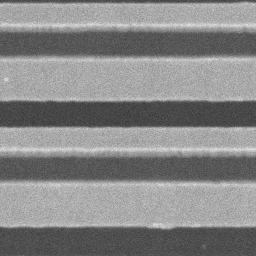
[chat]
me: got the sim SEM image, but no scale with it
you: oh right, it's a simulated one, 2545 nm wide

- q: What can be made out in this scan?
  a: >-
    lines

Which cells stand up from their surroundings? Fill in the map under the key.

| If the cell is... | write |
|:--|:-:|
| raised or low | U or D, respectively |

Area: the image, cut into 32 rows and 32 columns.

UUUUUUUUUUUUUUUUUUUUUUUUUUUUUUUU
UUUUUUUUUUUUUUUUUUUUUUUUUUUUUUUU
UUUUUUUUUUUUUUUUUUUUUUUUUUUUUUUU
DDDDDDDDDDDDDDDDDDDDDDDDDDDDDDDD
DDDDDDDDDDDDDDDDDDDDDDDDDDDDDDDD
DDDDDDDDDDDDDDDDDDDDDDDDDDDDDDDD
DDDDDDDDDDDDDDDDDDDDDDDDDDDDDDDD
UDUUUUUUUUUUUDUUUUUUUUUUUUUUUUUU
UUUUUUUUUUUUUUUUUUUUUUUUUUUUUUUU
UUUUUUUUUUUUUUUUUUUUUUUUUUUUUUUU
UUUUUUUUUUUUUUUUUUUUUUUUUUUUUUUU
UUUUUUUUUUUUUUUUUUUUUUUUUUUUUUUU
UUDUUUUUUUUUUUUUUUUUUUUUUDUUUUUD
DDDDDDDDDDDDDDDDDDDDDDDDDDDDDDDD
DDDDDDDDDDDDDDDDDDDDDDDDDDDDDDDD
DDDDDDDDDDDDDDDDDDDDDDDDDDDDDDDD
UUUUUUUUUUUUUUUUUUUUUUUUUUUUUUUU
UUUUUUUUUUUUUUUUUUUUUUUUUUUUUUUU
UUUUUUUUUUUUUUUUUUUUUUUUUUUUUUUU
DDDDDDDDDDDDDDDDDDDDDDDDDDDDDDDD
DDDDDDDDDDDDDDDDDDDDDDDDDDDDDDDD
DDDDDDDDDDDDDDDDDDDDDDDDDDDDDDDD
DDDDDDDDDDDDDDDDDDDDDDDDDDDDDDDD
UUUUUUUUUUUUUUUUUUUUUUUUUUUUUUUU
UUUUUUUUUUUUUUUUUUUUUUUUUUUUUUUU
UUUUUUUUUUUUUUUUUUUUUUUUUUUUUUUU
UUUUUUUUUUUUUUUUUUUUUUUUUUUUUUUU
UUUUUUUUUUUUUUUUUUUUUUUUUUUUUUUU
DDDDDDDDDDDDDDDDDDDDUUDDDDDDDDDD
DDDDDDDDDDDDDDDDDDDDDDDDDDDDDDDD
DDDDDDDDDDDDDDDDDDDDDDDDDDDDDDDD
DDDDDDDDDDDDDDDDDDDDDDDDDDDDDDDD